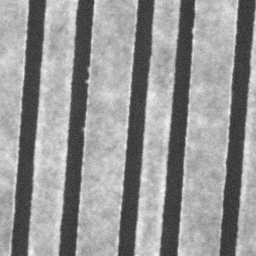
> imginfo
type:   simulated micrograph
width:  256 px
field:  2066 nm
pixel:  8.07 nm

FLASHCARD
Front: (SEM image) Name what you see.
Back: lines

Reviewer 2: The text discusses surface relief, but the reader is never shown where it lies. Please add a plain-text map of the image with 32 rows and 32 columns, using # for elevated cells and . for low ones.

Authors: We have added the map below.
####..###...#####...##..######..
####..###...#####...##..######..
###...###...#####...##..######..
###...###...#####..###..#####...
###...###...#####..###..#####...
###...###..######..###..#####...
###...###..######..###..#####...
###...###..######..###..#####...
###..####..#####...###..#####...
###..####..#####...###..#####...
###..####..#####...##...#####...
###..###...#####...##...#####..#
###..###...#####...##...#####..#
###..###...#####...##...#####..#
###..###...#####...##..######..#
###..###...#####..###..######..#
##...###...#####..###..######..#
##...###...#####..###..######..#
##...###..######..###..#####...#
##...###..######..###..#####...#
##...###..######..###..#####...#
##...###..######..##...#####...#
##..####..#####...##...#####...#
##..####..#####...##...#####..##
##..####..#####...##...#####..##
##..###...#####...##...#####..##
##..###...#####...##...#####..##
##..###...#####..###...#####..##
##..###...#####..###...#####..##
#...###...#####..###..######..##
#...###...#####..###..#####...##
#...###...#####..###..#####...##